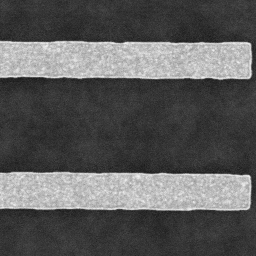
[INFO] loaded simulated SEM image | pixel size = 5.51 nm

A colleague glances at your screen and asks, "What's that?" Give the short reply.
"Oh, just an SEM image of wiring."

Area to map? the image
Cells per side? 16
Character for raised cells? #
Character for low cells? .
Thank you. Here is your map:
................
................
................
################
################
................
................
................
................
................
................
################
################
................
................
................